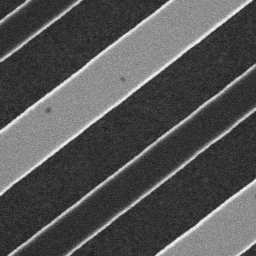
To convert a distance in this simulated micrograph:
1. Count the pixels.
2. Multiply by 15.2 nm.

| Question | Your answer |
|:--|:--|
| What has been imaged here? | lines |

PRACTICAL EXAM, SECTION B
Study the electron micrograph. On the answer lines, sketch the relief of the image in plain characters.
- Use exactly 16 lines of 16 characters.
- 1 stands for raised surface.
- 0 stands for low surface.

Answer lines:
0111000000111110
1110000001111100
1100000111111000
1000001111100000
0000011111000001
0000111110000011
0011111000000111
0111110000001110
1111100000111100
1110000001111000
1100000011100000
1000001111000000
0000011110000011
0000111000000111
0011110000001111
0111100000111111